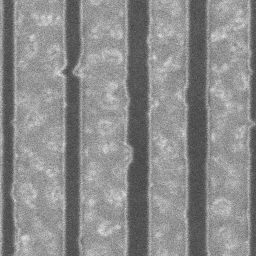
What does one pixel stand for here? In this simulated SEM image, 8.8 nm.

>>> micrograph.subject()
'one or a few lines or trenches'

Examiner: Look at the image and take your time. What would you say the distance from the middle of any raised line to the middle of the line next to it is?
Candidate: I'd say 548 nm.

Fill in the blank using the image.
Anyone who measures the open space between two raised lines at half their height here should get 350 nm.